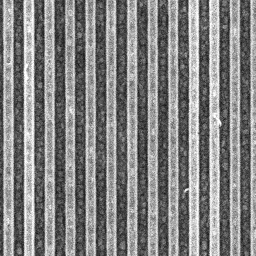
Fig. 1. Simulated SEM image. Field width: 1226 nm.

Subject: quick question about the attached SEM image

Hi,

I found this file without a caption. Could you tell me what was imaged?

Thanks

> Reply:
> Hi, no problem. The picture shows parallel lines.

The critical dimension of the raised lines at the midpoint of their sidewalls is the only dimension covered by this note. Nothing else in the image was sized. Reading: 0.0425 micrometres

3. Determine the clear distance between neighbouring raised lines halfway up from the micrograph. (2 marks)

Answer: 0.0557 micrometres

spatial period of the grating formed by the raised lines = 98.4 nm